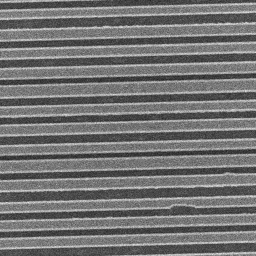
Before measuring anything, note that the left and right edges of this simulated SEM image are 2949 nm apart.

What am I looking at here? parallel lines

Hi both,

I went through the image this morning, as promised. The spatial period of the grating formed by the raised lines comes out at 220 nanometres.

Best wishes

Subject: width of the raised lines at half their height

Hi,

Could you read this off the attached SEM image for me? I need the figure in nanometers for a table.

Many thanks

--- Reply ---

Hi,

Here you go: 112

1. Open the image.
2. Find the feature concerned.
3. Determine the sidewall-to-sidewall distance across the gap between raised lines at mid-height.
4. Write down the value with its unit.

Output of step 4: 0.101 um